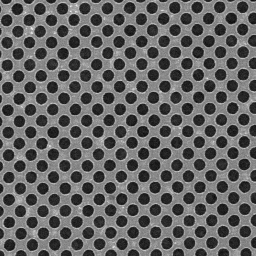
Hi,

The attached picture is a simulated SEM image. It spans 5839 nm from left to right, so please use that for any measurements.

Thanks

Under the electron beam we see a regular array of holes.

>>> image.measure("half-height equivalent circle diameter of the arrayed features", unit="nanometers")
276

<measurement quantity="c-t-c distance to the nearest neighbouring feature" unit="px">15.7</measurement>